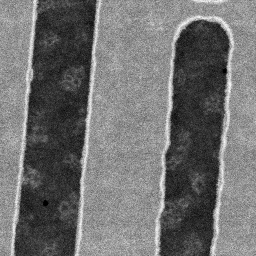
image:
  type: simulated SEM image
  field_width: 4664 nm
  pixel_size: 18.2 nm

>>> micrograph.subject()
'one or a few lines or trenches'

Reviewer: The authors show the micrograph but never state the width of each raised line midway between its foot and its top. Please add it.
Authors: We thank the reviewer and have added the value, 78.2 pixels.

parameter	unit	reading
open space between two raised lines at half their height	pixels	62.5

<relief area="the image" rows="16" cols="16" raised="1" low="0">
1100001111111111
1100001111110011
1100001111100011
1100001111100011
1100001111100011
1100001111100011
1100001111100011
1100001111000011
1000011111000011
1000011111000011
1000011111000011
1000011111000011
1000011111000011
1000011111000011
1000011111000011
1000011111000111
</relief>